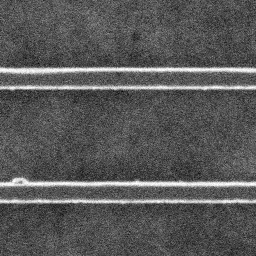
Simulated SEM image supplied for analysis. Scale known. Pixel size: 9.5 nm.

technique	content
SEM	lines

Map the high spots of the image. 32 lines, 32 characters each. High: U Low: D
DDDDDDDDDDDDDDDDDDDDDDDDDDDDDDDD
DDDDDDDDDDDDDDDDDDDDDDDDDDDDDDDD
DDDDDDDDDDDDDDDDDDDDDDDDDDDDDDDD
DDDDDDDDDDDDDDDDDDDDDDDDDDDDDDDD
DDDDDDDDDDDDDDDDDDDDDDDDDDDDDDDD
DDDDDDDDDDDDDDDDDDDDDDDDDDDDDDDD
DDDDDDDDDDDDDDDDDDDDDDDDDDDDDDDD
DDDDDDDDDDDDDDDDDDDDDDDDDDDDDDDD
DDDDDDDDDDDDDDDDDDDDDDDDDDDDDDDD
UUUUUUUUUUUUUUUUUUUUUUUUUUUUUUUU
UUUUUUUUUUUUUUUUUUUUUUUUUUUUUUUU
DDDDDDDDDDDDDDDDDDDDDDDDDDDDDDDD
DDDDDDDDDDDDDDDDDDDDDDDDDDDDDDDD
DDDDDDDDDDDDDDDDDDDDDDDDDDDDDDDD
DDDDDDDDDDDDDDDDDDDDDDDDDDDDDDDD
DDDDDDDDDDDDDDDDDDDDDDDDDDDDDDDD
DDDDDDDDDDDDDDDDDDDDDDDDDDDDDDDD
DDDDDDDDDDDDDDDDDDDDDDDDDDDDDDDD
DDDDDDDDDDDDDDDDDDDDDDDDDDDDDDDD
DDDDDDDDDDDDDDDDDDDDDDDDDDDDDDDD
DDDDDDDDDDDDDDDDDDDDDDDDDDDDDDDD
DDDDDDDDDDDDDDDDDDDDDDDDDDDDDDDD
DDDDDDDDDDDDDDDDDDDDDDDDDDDDDDDD
UUUUUUUUUUUUUUUUUUUUUUUUUUUUUUUU
UUUUUUUUUUUUUUUUUUUUUUUUUUUUUUUU
DDDDDDDDDDDDDDDDDDDDDDDDDDDDDDDD
DDDDDDDDDDDDDDDDDDDDDDDDDDDDDDDD
DDDDDDDDDDDDDDDDDDDDDDDDDDDDDDDD
DDDDDDDDDDDDDDDDDDDDDDDDDDDDDDDD
DDDDDDDDDDDDDDDDDDDDDDDDDDDDDDDD
DDDDDDDDDDDDDDDDDDDDDDDDDDDDDDDD
DDDDDDDDDDDDDDDDDDDDDDDDDDDDDDDD